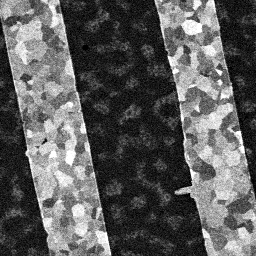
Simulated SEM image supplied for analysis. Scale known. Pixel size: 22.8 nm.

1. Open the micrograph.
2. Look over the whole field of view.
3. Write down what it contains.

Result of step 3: one or a few lines or trenches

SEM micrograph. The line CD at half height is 59.7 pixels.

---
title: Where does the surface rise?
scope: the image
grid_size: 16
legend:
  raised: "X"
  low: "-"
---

XXXX------XXX---
XXXX------XXXX--
XXXX------XXXX--
-XXX-------XXX--
-XXXX------XXX--
-XXXX------XXX--
-XXXX------XXXX-
-XXXX------XXXX-
--XXX-------XXX-
--XXXX------XXX-
--XXXX------XXX-
--XXXX------XXXX
--XXXX------XXXX
---XXX------XXXX
---XXXX------XXX
---XXXX------XXX